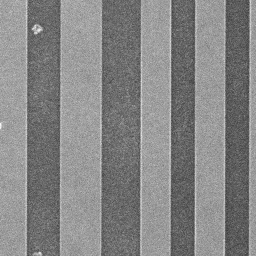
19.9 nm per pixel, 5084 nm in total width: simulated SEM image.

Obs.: groups of lines, slits or small figures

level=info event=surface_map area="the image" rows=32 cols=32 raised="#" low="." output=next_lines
###.....#####.....###...####...#
###.....#####.....###...####...#
###.....#####.....###...####...#
###.....#####.....###...####...#
###.....#####.....###...####...#
###.....#####.....###...####...#
###.....#####.....###...####...#
###.....#####.....###...####...#
###.....#####.....###...####...#
###.....#####.....###...####...#
###.....#####.....###...####...#
###.....#####.....###...####...#
###.....#####.....###...####...#
###.....#####.....###...####...#
###.....#####.....###...####...#
###.....#####.....###...####...#
###.....#####.....###...####...#
###.....#####.....###...####...#
###.....#####.....###...####...#
###.....#####.....###...####...#
###.....#####.....###...####...#
###.....#####.....###...####...#
###.....#####.....###...####...#
###.....#####.....###...####...#
###.....#####.....###...####...#
###.....#####.....###...####...#
###.....#####.....###...####...#
###.....#####.....###...####...#
###.....#####.....###...####...#
###.....#####.....###...####...#
###.....#####.....###...####...#
###.....#####.....###...####...#